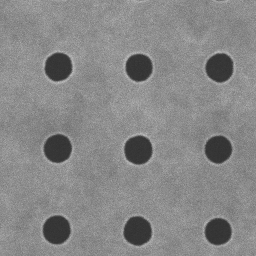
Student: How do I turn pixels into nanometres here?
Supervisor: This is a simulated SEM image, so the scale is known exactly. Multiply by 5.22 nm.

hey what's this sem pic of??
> a regular array of holes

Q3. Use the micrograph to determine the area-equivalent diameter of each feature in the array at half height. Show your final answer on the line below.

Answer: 150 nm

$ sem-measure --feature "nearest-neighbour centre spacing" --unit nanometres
420